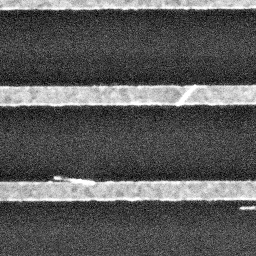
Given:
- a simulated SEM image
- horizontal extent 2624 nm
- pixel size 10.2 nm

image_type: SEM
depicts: lines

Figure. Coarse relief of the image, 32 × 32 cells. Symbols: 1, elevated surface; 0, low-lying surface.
11111111111111111111111111111111
00000000000000000000000000000000
00000000000000000000000000000000
00000000000000000000000000000000
00000000000000000000000000000000
00000000000000000000000000000000
00000000000000000000000000000000
00000000000000000000000000000000
00000000000000000000000000000000
00000000000000000000000000000000
00000000000000000000000000000000
11111111111111111111111111111111
11111111111111111111111111111111
00000000000000000000000000000000
00000000000000000000000000000000
00000000000000000000000000000000
00000000000000000000000000000000
00000000000000000000000000000000
00000000000000000000000000000000
00000000000000000000000000000000
00000000000000000000000000000000
00000000000000000000000000000000
00000000000000000000000000000000
11111111111111111111111111111111
11111111111111111111111111111111
00000000000000000000000000000000
00000000000000000000000000000000
00000000000000000000000000000000
00000000000000000000000000000000
00000000000000000000000000000000
00000000000000000000000000000000
00000000000000000000000000000000